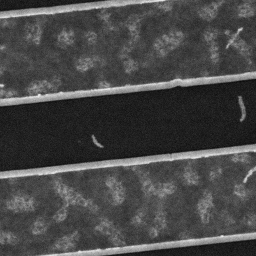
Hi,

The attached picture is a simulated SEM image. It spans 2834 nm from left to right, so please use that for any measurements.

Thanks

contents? one or a few lines or trenches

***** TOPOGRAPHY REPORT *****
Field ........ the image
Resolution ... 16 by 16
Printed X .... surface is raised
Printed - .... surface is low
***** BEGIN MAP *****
----XXXXXXXXXXXX
XXXXXXXXXXXXXXXX
XXXXXXXXXXXXXXXX
XXXXXXXXXXXXXXXX
XXXXXXXXXXXXXXXX
XXXXXXXXX-------
----------------
----------------
----------------
-------------XXX
----XXXXXXXXXXXX
XXXXXXXXXXXXXXXX
XXXXXXXXXXXXXXXX
XXXXXXXXXXXXXXXX
XXXXXXXXXXXXXXXX
XXXXXXXXX-------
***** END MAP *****